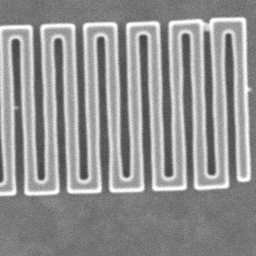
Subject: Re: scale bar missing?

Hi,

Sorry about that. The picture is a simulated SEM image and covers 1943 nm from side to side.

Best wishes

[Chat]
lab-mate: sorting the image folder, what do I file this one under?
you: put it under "groups of lines, slits or small figures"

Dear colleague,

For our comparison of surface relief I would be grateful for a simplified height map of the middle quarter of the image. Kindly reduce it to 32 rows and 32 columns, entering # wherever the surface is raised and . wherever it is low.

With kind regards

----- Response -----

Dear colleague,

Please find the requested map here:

###..###...##...###..###...##...
###..###...###..###..###...##...
###..###...###..###..###...##...
###..###...###..###..###...##...
###..###...###..###..###...##...
###..###...###..###..###...##...
###..###...###..###..###...##...
###...##...###..###..###...##...
###...##...###..###...##...##...
###...###..###..###...##...##...
###...###..###..###...##...##...
###...###..###..###...##...##...
###...###..###..###...##...###..
###...###..###..###...##...###..
###...###..###...##...##...###..
.##...###..###...##...##...###..
.##...###..###...##...##...###..
.##...###..###...##...##...###..
.##...###..###...##...###..###..
.###..###...##...##...###..###..
.###..###...##...##...###..###..
.###..###...##...##...###..###..
.###..###...##...##...###..###..
.###..###...##...##...###..###..
.###..###...##...##...###..###..
.###..###...##...##...###...##..
.###..###...##...##...###...##..
.###..###...##...##...###...##..
.###..###...###.####..####.###..
.########...########..########..
.########...########..########..
.########...#######.............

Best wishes